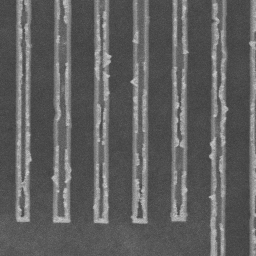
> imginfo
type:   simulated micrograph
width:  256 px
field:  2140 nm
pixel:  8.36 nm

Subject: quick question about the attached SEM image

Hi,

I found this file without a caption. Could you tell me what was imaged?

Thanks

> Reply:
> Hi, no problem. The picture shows parallel lines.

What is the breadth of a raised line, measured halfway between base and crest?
102 nm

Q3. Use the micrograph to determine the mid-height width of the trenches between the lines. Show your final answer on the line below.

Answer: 26.4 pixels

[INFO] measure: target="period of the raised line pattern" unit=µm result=0.327